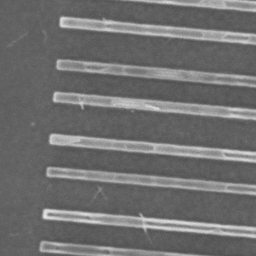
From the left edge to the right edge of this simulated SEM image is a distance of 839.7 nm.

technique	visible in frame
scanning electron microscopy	parallel lines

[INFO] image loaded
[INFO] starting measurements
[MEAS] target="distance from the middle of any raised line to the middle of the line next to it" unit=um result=0.125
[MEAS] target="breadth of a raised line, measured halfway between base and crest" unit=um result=0.0306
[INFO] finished